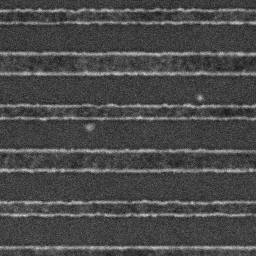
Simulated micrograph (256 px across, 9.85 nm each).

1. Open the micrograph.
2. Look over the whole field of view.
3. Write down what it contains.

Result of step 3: lines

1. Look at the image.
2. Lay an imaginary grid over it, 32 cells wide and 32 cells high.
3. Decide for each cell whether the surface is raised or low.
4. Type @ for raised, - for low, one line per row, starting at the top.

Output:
--------------------------------
@@@@@@@@@@@@@@@@@@@@@@@@@@@@@@@@
@@@@@@@@@@@@@@@@@@@@@@@@@@@@@@@@
--------------------------------
--------------------------------
--------------------------------
--------------------------------
@@@@@@@@@@@@@@@@@@@@@@@@@@@@@@@@
@@@@@@@@@@@@@@@@@@@@@@@@@@@@@@@@
--------------------------------
--------------------------------
--------------------------------
--------------------------------
@@@@@@@@@@@@@@@@@@@@@@@@@@@@@@@@
@@@@@@@@@@@@@@@@@@@@@@@@@@@@@@@@
--------------------------------
--------------------------------
--------------------------------
--------------------------------
@@@@@@@@@@@@@@@@@@@@@@@@@@@@@@@@
@@@@@@@@@@@@@@@@@@@@@@@@@@@@@@@@
--------------------------------
--------------------------------
--------------------------------
--------------------------------
@@@@@@@@@@@@@@@@@@@@@@@@@@@@@@@@
@@@@@@@@@@@@@@@@@@@@@@@@@@@@@@@@
--------------------------------
--------------------------------
--------------------------------
--------------------------------
@@@@@@@@@@@@@@@@@@@@@@@@@@@@@@@@